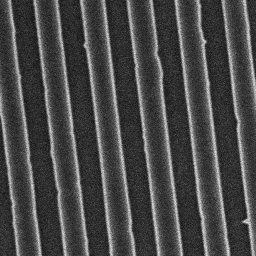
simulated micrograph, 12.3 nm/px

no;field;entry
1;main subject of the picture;parallel lines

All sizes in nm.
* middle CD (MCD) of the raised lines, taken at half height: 278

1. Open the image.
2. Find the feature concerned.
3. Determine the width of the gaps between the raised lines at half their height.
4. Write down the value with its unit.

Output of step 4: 0.301 µm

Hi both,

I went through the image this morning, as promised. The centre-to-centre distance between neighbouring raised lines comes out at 46.6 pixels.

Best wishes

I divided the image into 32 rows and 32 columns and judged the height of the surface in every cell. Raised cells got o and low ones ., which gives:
o...ooo...ooo...ooo...ooo...ooo.
o...ooo...ooo...ooo...ooo...ooo.
oo...oo...ooo...ooo...ooo...ooo.
oo...ooo...oo...ooo...ooo...ooo.
oo...ooo...oo...oooo...oo...ooo.
oo...ooo...ooo...ooo...ooo..ooo.
oo...ooo...ooo...ooo...ooo...oo.
oo...ooo...ooo...ooo...ooo...oo.
oo...ooo...ooo...ooo...ooo...oo.
oo...ooo...ooo...ooo...ooo...ooo
oo....oo....oo...ooo...ooo...ooo
ooo...ooo...oo...ooo...ooo...ooo
ooo...ooo...oo....oo...ooo...ooo
ooo...ooo...ooo...oo....oo...ooo
ooo...ooo...ooo...ooo...oo....oo
ooo...ooo...ooo...ooo...ooo...oo
ooo...ooo...ooo...ooo...ooo...oo
.oo...ooo...ooo...ooo...ooo...oo
.ooo..ooo...ooo...ooo...ooo...oo
.ooo...oo....oo...ooo...ooo...oo
.ooo...ooo...oo....oo...ooo...oo
.ooo...ooo...ooo...oo...ooo...oo
.ooo...ooo...ooo...ooo...oo...oo
.ooo...ooo...ooo...ooo...oo....o
.ooo...ooo...ooo...ooo...ooo...o
..oo...ooo...ooo...ooo...ooo...o
..oo...ooo...ooo...ooo...ooo...o
..ooo...oo...ooo...ooo...ooo...o
..ooo...ooo...oo...ooo...ooo...o
..ooo...ooo...ooo...oo....oo...o
..ooo...ooo...ooo...ooo...oo...o
..ooo...ooo...ooo...ooo...ooo...